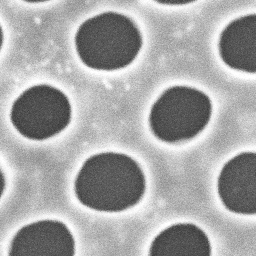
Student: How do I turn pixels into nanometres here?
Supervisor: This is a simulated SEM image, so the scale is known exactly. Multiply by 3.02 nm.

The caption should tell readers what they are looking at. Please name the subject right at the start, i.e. holes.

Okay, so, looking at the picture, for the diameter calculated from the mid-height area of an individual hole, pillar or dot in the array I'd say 188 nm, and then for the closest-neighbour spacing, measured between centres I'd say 294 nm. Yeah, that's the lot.